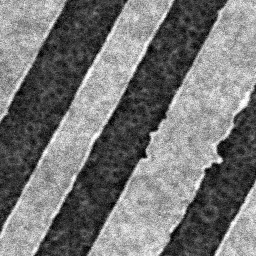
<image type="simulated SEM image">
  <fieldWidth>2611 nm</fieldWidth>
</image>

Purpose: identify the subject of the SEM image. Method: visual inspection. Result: one or a few lines or trenches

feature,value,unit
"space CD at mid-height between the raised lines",500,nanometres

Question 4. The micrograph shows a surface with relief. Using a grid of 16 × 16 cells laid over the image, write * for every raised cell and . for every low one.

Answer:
****....***...**
***....***...***
***....**....***
**....***...****
**....**....****
*....***...*****
*...***....****.
....***...*****.
...***....****..
...***...*****..
..***....****...
..***...****....
.***...*****...*
.**....****....*
***...*****...**
**....****....**